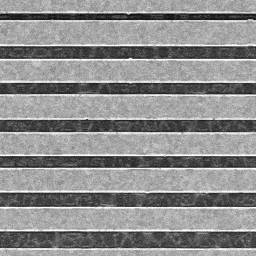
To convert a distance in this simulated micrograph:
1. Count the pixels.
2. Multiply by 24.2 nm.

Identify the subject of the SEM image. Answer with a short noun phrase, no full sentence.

parallel lines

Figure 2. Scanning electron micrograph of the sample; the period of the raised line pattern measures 901 nanometres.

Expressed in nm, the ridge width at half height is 572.